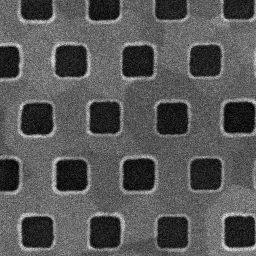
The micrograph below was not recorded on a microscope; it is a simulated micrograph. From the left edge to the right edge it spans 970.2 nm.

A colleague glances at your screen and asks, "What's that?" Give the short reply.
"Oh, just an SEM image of a regular array of holes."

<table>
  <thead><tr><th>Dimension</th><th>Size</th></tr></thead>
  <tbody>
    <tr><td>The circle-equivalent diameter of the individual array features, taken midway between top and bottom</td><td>138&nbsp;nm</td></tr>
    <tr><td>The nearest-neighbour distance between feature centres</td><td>250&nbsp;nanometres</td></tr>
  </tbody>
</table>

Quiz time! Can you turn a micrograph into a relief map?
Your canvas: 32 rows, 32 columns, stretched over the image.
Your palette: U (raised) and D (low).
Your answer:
UUUDDDDUUUUDDDDUUUUDDDDUUUUUDDDD
UUUDDDDUUUUDDDDUUUUDDDDUUUUUDDDD
UUUDDDUUUUUUDDUUUUUUDDDUUUUUDDDU
UUUUUUUUUUUUUUUUUUUUUUUUUUUUUUUU
UUUUUUUUUUUUUUUUUUUUUUUUUUUUUUUU
UUUUUUUUDUUUUUUUUUUUUUUUUUDUUUUU
DDUUUUUDDDDUUUUDDDDUUUUUDDDDUUUU
DDDUUUUDDDDUUUUDDDDUUUUUDDDDUUUU
DDUUUUUDDDDUUUUDDDDUUUUUDDDDUUUU
DDUUUUUDDDUUUUUUDDDUUUUUDDDUUUUU
UUUUUUUUUUUUUUUUUUUUUUUUUUUUUUUU
UUUUUUUUUUUUUUUUUUUUUUUUUUUUUUUU
UUUUUUUUUUUUUUUUUUUUUUUUUUUUUUUU
UUUDDDDUUUUDDDDUUUUUDDDUUUUUDDDD
UUUDDDDUUUUDDDDUUUUDDDDDUUUUDDDD
UUUDDDDUUUUDDDDUUUUDDDDDUUUUDDDD
UUUDDDUUUUUDDDDUUUUUDDDUUUUUDDDU
UUUUUUUUUUUUUUUUUUUUUUUUUUUUUUUU
UUUUUUUUUUUUUUUUUUUUUUUUUUUUUUUU
UUUUUUUUUUUUUUUUUUUUUUUUUUUUUUUU
DDUUUUUDDDDUUUUDDDDUUUUUDDDDUUUU
DDUUUUUDDDDUUUUDDDDUUUUUDDDDUUUU
DDUUUUUDDDDUUUUDDDDUUUUUDDDDUUUU
DDUUUUUDDDDUUUUDDDDUUUUUDDDUUUUU
UUUUUUUUUUUUUUUUUUUUUUUUUUUUUUUU
UUUUUUUUUUUUUUUUUUUUUUUUUUUUUUUU
UUUUUUUUUUUUUUUUUUUUUUUUUUUUUUUU
UUUDDDDUUUUDDDDUUUUUDDDDUUUUDDDD
UUUDDDDUUUUDDDDUUUUDDDDDUUUUDDDD
UUUDDDDUUUUDDDDUUUUDDDDDUUUUDDDD
UUUDDDDUUUUDDDDUUUUUDDDDUUUUDDDD
UUUUUUUUUUUUUUUUUUUUUUUUUUUUUUUU